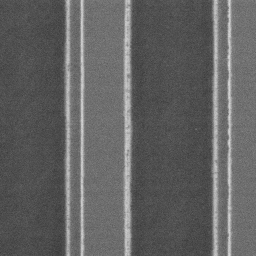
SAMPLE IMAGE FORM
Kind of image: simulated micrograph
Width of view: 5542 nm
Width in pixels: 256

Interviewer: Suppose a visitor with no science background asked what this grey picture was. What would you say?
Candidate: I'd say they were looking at lines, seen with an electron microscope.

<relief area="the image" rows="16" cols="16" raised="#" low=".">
....####......##
....####......##
....####......##
....####......##
....####......##
....####......##
....####......##
....####......##
....####......##
....####......##
....####......##
....####......##
....####......##
....####......##
....####......##
....####......##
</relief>